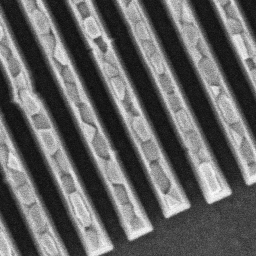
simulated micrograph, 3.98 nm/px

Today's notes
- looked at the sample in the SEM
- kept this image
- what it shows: parallel lines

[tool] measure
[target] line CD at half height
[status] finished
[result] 0.0866 µm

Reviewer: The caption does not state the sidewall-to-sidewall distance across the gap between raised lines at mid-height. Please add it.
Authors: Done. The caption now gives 86.6 nm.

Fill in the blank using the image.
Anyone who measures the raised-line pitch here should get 172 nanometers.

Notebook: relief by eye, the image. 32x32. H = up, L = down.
LLLHHHLLLHHHLLLHHHLLLHHHLLLHHHLL
LLLHHHLLLHHHLLLHHHLLLHHHLLLHHHLL
HLLLHHHLLHHHHLLLHHHLLLHHHLLLHHHL
HLLLHHHLLLHHHLLLHHHLLLHHHLLLHHHL
HLLLHHHLLLHHHHLLLHHLLLLHHLLLLHHL
HHLLLHHHLLLHHHLLLHHHLLLHHHLLLHHH
HHLLLLHHLLLHHHLLLLHHLLLHHHLLLHHH
HHHLLLHHHLLLHHHLLLHHHLLLHHHLLLHH
HHHLLLHHHLLLHHHLLLHHHLLLHHHLLLHH
LHHHLLLHHHLLLHHHLLLHHHLLLHHHLLLH
LHHHLLLHHHLLLHHHLLLHHHLLLHHHLLLH
LHHHLLLLHHHLLLHHHLLLHHHLLLHHHLLL
LLHHHLLLHHHLLLHHHLLLHHHLLLHHHLLL
LLLHHHLLLHHHLLLHHHLLLHHHLLLHHHLL
LLLHHHLLLHHHLLLHHHLLLHHHLLLHHHLL
LLLLHHHLLLHHHLLLHHHLLLHHHLLLHHHL
HLLLHHHLLLHHHLLLHHHLLLHHHLLLHHHL
HHLLLHHHLLLHHHLLHHHHLLLHHLLLLHHH
HHLLLHHHLLLHHHLLLHHHLLLHHHLLLHHH
HHLLLLHHLLLHHHHLLHHHHLLLHHLLLLHH
HHHLLLHHHLLLHHHLLLHHHLLLHHHLLLHH
HHHLLLHHHLLLLHHLLLHHHHLLLHHLLLHH
LHHHLLLHHHLLLHHHLLLHHHLLLHHHLLLH
LHHHLLLHHHLLLHHHLLLHHHLLLHHHLLLL
LLHHHLLLHHHLLLHHHLLLHHHLLLHHLLLL
LLHHHLLLHHHLLLHHHLLLHHHLLLLLLLLL
LLLHHHLLLHHHLLLHHHLLLHLLLLLLLLLL
LLLHHHLLLHHHLLLHHHLLLLLLLLLLLLLL
HLLLHHHLLLHHHLLLHHLLLLLLLLLLLLLL
HLLLHHHLLLHHHLLLLLLLLLLLLLLLLLLL
HHLLLHHHLLLHHHLLLLLLLLLLLLLLLLLL
HHLLLHHHLLLHLLLLLLLLLLLLLLLLLLLL